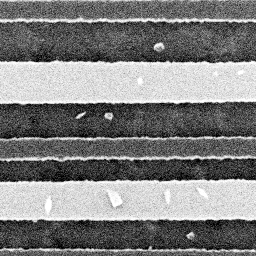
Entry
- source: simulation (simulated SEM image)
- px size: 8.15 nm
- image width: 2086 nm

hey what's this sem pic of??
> lines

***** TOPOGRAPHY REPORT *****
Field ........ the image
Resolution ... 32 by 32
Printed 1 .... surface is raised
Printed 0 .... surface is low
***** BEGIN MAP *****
11111111111111111111111111111111
11111111111111111111111111111111
11111111111111111111111111111111
00000000000000000000000000000000
00000000000000000000000000000000
00000000000000000000000000000000
00000000000000000000000000000000
00000000000000000000000000000000
11111111111111111111111111111111
11111111111111111111111111111111
11111111111111111111111111111111
11111111111111111111111111111111
11111111111111111111111111111111
00000000000000000000000000000000
00000000000000000000000000000000
00000000000000000000000000000000
00000000000000000000000000000000
11111111111111111111111111111111
11111111111111111111111111111111
11111111111111111111111111111111
00000000000000000000000000000000
00000000000000000000000000000000
00000000000000000000000000000000
11111111111111111111111111111111
11111111111111111111111111111111
11111111111111111111111111111111
11111111111111111111111111111111
00000000000000000000000000000000
00000000000000000000000000000000
00000000000000000000000000000000
00000000000000000000000000000000
11111111111111111111111111111111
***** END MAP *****